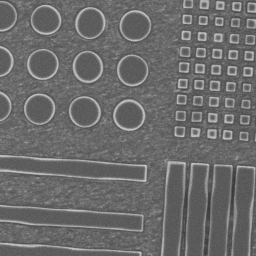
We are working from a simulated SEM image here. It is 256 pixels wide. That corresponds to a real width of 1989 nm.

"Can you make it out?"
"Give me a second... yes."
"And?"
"groups of lines, slits or small figures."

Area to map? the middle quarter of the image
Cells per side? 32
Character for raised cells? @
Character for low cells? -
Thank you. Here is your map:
--@@@@@@@-----@@@@@@@--------@@-
---@@@@@@-----@@@@@@@--------@@-
---@@@@@@-----@@@@@@@-----------
----@@@@------@@@@@@------------
---------------@@@@@---------@@-
-----------------------------@@-
--------------------------------
--------------------------------
---@@@@---------------------@@--
--@@@@@@-------@@@----------@@--
--@@@@@@@----@@@@@@-------------
--@@@@@@@----@@@@@@@------------
--@@@@@@@----@@@@@@@--------@@--
--@@@@@@@----@@@@@@@--------@@--
--@@@@@@-----@@@@@@@------------
----@@@-------@@@@@-------------
----------------------------@@--
----------------------------@@--
--------------------------------
--------------------------------
--------------------------------
--------------------------------
--------------------------------
--------------------------------
@@@@@@@@------------------------
@@@@@@@@@@@@@@@@@@@@------@@@@--
@@@@@@@@@@@@@@@@@@@@------@@@@--
@@@@@@@@@@@@@@@@@@@@------@@@@--
-------@@@@@@@@@@@@@------@@@@--
--------------------------@@@@--
--------------------------@@@@--
--------------------------@@@@-@